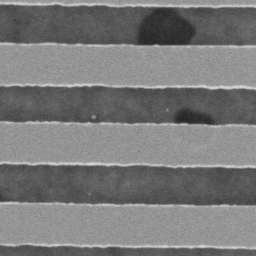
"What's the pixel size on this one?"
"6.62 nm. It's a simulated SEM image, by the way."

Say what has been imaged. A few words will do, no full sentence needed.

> lines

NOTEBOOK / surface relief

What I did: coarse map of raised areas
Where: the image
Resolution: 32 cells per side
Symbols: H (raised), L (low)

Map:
LLLHHHLHHHHHHHHHHHHHHHHHHHHHHHHH
LLLLLLLLLLLLLLLLLLLLLLLLLLLLLLLL
LLLLLLLLLLLLLLLLLLLLLLLLLLLLLLLL
LLLLLLLLLLLLLLLLLLLLLLLLLLLLLLLL
LLLLLLLLLLLLLLLLLLLLLLLLLLLLLLLL
HHLLLHHLLLLLLLLLLLLLLLLLLLLLLLLL
HHHHHHHHHHHHHHHHHHHHHHHHHHHHHHHH
HHHHHHHHHHHHHHHHHHHHHHHHHHHHHHHH
HHHHHHHHHHHHHHHHHHHHHHHHHHHHHHHH
HHHHHHHHHHHHHHHHHHHHHHHHHHHHHHHH
HHHHHHHHHHHHHHHHHHHHHHHHHHHHHHHH
LLLLLLLLLLLLLLLLLLLLLLLLLLLLLLLL
LLLLLLLLLLLLLLLLLLLLLLLLLLLLLLLL
LLLLLLLLLLLLLLLLLLLLLLLLLLLLLLLL
LLLLLLLLLLLLLLLLLLLLLLLLLLLLLLLL
HHHHHHHHHHHHHHHLLLLLLLLLLLLLLLLL
HHHHHHHHHHHHHHHHHHHHHHHHHHHHHHHH
HHHHHHHHHHHHHHHHHHHHHHHHHHHHHHHH
HHHHHHHHHHHHHHHHHHHHHHHHHHHHHHHH
HHHHHHHHHHHHHHHHHHHHHHHHHHHHHHHH
LLLLHLLLLLHLHHHHHLHHHHHHHHHHHHHH
LLLLLLLLLLLLLLLLLLLLLLLLLLLLLLLL
LLLLLLLLLLLLLLLLLLLLLLLLLLLLLLLL
LLLLLLLLLLLLLLLLLLLLLLLLLLLLLLLL
LLLLLLLLLLLLLLLLLLLLLLLLLLLLLLLL
HHHHHHHHHHLLLLLLLLLLLLLLLLLLLLLL
HHHHHHHHHHHHHHHHHHHHHHHHHHHHHHHH
HHHHHHHHHHHHHHHHHHHHHHHHHHHHHHHH
HHHHHHHHHHHHHHHHHHHHHHHHHHHHHHHH
HHHHHHHHHHHHHHHHHHHHHHHHHHHHHHHH
HHHHHHHHHHHHHHHHHHHHHHHHHHHHHHHH
LLLLLLLLLLLLLLLLLLLLLLLLLLLLLLLL